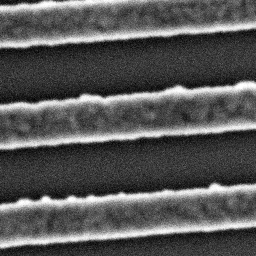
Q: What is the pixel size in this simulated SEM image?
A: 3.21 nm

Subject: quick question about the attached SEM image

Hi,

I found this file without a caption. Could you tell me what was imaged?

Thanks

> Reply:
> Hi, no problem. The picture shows lines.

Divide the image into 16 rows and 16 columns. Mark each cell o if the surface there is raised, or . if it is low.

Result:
oooooooooooooooo
oooooooooooooooo
oooooo..........
................
................
..............oo
.ooooooooooooooo
oooooooooooooooo
oooooooooo......
................
................
................
....oooooooooooo
oooooooooooooooo
ooooooooooo.....
................